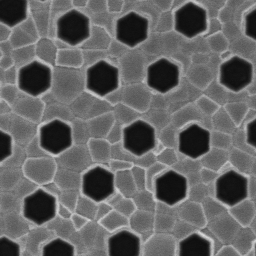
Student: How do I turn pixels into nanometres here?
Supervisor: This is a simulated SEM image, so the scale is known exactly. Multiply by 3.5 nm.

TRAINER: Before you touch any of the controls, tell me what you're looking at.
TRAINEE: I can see a regular array of holes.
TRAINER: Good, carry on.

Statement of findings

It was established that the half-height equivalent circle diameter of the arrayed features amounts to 106 nanometers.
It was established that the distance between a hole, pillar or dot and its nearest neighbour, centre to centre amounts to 0.207 micrometres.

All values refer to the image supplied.